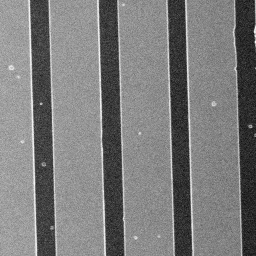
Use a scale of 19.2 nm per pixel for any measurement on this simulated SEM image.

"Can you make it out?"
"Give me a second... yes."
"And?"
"one or a few lines or trenches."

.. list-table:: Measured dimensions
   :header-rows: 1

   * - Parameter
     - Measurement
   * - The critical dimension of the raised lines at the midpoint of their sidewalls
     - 0.388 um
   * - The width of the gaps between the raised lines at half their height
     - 48.4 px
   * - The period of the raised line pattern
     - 1310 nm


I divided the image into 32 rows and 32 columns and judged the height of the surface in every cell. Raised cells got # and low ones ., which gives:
....##......###......##......###
....##......###......##......###
....##......###......##......###
....##......###......##......###
....##......###......##......###
....##......###......##......###
....##......###......##......###
....##......###......##.......##
....##.......##......##......###
....##.......##......##.......##
....##.......##......##.......##
....##.......##......###......##
....##.......##......###......##
....###......##......###......##
....###......##......###......##
....###......##......###......##
....###......##......###......##
....###......##......###......##
....###......##......###......##
....###......##......###......##
....###......##......###......##
....###......##......###......##
....###......##.......##......##
....###......##.......##......##
....###......##.......##......##
....###......##.......##......##
....###......##.......##......##
....###......##.......##......##
....###......###......##......##
.....##......###......##......##
.....##......###......##......##
.....##......###......##......##